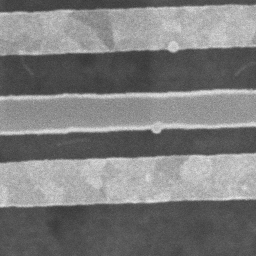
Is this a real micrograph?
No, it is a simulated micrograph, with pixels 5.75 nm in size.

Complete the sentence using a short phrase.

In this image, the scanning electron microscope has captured lines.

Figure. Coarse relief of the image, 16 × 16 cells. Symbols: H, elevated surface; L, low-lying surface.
LLLLLLLLLLHHHHHH
HHHHHHHHHHHHHHHH
HHHHHHHHHHHHHHHH
LLLLLLLLLLLLLLLL
LLLLLLLLLLLLLLLL
LLLLLLLLLLLLLLLL
HHHHHHHHHHHHHHHH
HHHHHHHHHHHHHHHH
LLLLLLLLLLLLLLLL
LLLLLLLLLLLLLLLL
HHHHHHHHHHHHHHHH
HHHHHHHHHHHHHHHH
HHHHHHHHHHHHLLLL
LLLLLLLLLLLLLLLL
LLLLLLLLLLLLLLLL
LLLLLLLLLLLLLLLL